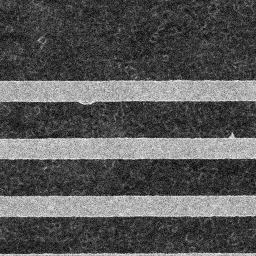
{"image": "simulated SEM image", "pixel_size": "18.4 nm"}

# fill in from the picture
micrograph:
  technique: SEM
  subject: parallel lines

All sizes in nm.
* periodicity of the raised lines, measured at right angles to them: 1060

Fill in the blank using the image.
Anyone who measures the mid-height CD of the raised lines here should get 370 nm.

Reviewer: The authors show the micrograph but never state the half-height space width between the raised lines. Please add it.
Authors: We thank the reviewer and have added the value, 688 nanometers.